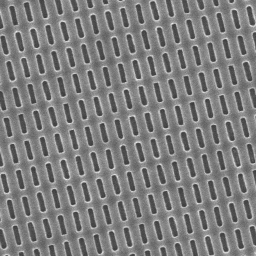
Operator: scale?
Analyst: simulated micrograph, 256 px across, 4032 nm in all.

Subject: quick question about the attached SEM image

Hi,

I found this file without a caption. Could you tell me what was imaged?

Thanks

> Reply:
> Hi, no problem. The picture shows a regular array of holes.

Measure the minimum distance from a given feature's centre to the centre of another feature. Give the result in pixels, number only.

15.3